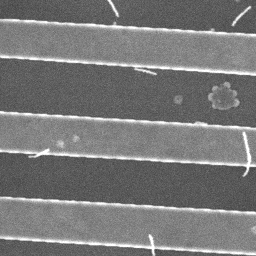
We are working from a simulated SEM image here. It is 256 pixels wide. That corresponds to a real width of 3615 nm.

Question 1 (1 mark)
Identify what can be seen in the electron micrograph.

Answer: lines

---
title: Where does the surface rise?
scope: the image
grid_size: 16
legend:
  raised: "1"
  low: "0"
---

0000000000000000
1111100000000000
1111111111111111
1111111111111111
0000000000000111
0000000000000000
0000000000000000
1111111100000000
1111111111111111
1111111111111111
0000000000000000
0000000000000000
1110000000000000
1111111111111111
1111111111111111
0000000001111111